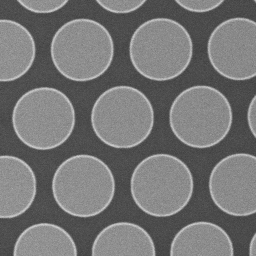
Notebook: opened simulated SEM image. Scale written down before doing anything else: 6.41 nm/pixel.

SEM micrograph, an array of small figures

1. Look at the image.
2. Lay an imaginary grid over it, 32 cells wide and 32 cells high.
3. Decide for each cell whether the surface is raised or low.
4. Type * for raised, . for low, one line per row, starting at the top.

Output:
...*****....******....*****.....
....**........**................
.........**........**........**.
***.....*****....******....*****
****...*******...*******..******
****..********..********..******
****..********..********..******
****...*******..********..******
****...******....******....*****
***.....****......****......****
................................
....***......****......****.....
..*******...******....******....
..*******...*******..********..*
..*******..********..********..*
..*******...*******..********..*
..*******...*******...******....
...*****.....*****.....*****....
....**..........................
..........*........**........***
***.....*****....******....*****
****...*******...*******...*****
****...*******..********..******
****...*******..********..******
****...*******...*******..******
****...*******...******....*****
***.....*****.....****......****
................................
....****.....*****.....****.....
..*******...*******...******....
..*******...*******...*******..*
..********..*******..********..*